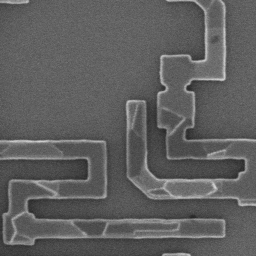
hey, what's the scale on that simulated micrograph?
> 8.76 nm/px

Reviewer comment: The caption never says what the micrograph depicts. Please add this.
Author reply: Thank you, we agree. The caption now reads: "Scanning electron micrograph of wiring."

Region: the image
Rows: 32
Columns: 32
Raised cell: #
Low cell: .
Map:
.........................###....
..........................##....
..........................##....
..........................##....
..........................##....
..........................##....
..........................##....
....................####.###....
....................########....
....................########....
....................####........
....................####........
....................####........
................##..####........
................##..####........
................##..####........
................##...##.........
................##...###.#######
#############...##...###########
#############...##...###########
...........##...##.............#
...........##...###...........##
..........###...################
.############....###############
.############.....##############
.##...........................##
.###............................
######...#.##..######.######....
############################....
############################....
.#.#............................
................................